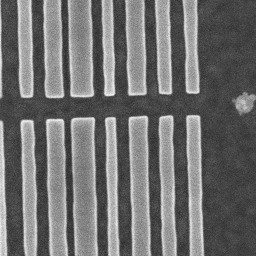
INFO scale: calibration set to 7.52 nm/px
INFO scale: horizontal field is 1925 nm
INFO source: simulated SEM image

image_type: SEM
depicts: groups of lines, slits or small figures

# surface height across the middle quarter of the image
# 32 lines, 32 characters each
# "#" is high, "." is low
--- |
..#####...##....####....###....#
..#####...##....####....###....#
..#####...##....####....###....#
..#####...##....####....###....#
..#####...##....####....###....#
..#####...##....####....###....#
..#####...##....####....###....#
..#####...##.....###............
................................
................................
................................
................................
................................
...........#.....####...###....#
..#####...###...#####...###....#
..#####...###...#####...###....#
..#####....##...#####...###....#
..#####....##...#####...###....#
..#####....##....####...###....#
..#####....##....####...###....#
..#####....##....####...###....#
..#####....##....####...###....#
..#####....##....####...###....#
..#####....##....####...###....#
..######...##....####...###....#
..######...##....####...###....#
..######...##....####...###....#
..######...##....####...###....#
..######...##....####...###....#
...#####...##....####...###....#
...#####...##....####....##....#
...#####...##....####....##....#